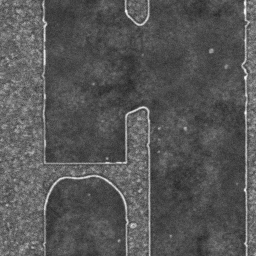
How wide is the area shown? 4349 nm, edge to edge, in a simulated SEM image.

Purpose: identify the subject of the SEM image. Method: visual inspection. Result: one or a few lines or trenches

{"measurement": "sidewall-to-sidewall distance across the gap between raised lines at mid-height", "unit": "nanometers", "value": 1620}